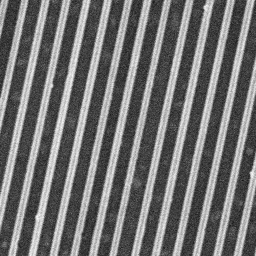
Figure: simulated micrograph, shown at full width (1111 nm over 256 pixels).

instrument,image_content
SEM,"parallel lines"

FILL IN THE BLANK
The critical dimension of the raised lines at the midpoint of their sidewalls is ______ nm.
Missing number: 24.4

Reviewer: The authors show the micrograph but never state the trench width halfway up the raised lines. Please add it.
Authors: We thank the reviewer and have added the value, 61.5 nm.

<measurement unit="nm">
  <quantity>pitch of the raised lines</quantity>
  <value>87.2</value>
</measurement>